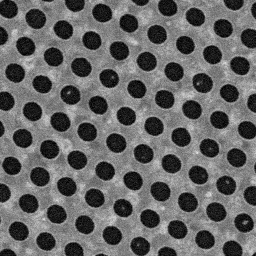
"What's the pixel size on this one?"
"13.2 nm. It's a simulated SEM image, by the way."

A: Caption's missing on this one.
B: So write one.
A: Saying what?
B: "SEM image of a regular array of holes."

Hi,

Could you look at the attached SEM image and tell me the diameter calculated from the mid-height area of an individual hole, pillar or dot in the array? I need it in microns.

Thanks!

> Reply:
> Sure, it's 0.269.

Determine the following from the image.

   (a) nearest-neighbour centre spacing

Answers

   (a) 382 nanometres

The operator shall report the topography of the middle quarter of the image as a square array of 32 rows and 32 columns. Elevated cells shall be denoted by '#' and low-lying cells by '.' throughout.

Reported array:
##.....###########.....##....###
##.....###..#######...###.....##
##.....##....############.....##
#########.....############....##
#########.....##....############
...#######...###....############
....############.....###..######
....############....###....#####
....###...#######..####.....####
....##.....############.....##..
######.....############....###..
#######....##....############...
.#######..###.....############..
.############.....###..########.
..###.########....##.....#######
..##....############.....#######
.##.....############.....##....#
###.....###...#######...###.....
####....##.....############.....
######.###......###########.....
###########.....##...#######...#
##..#######....##.....##########
#....############......###.#####
#.....############....###....###
#.....###..#######....##.....###
#.....##....############.....###
###.####.....############....##.
########.....##....########.###.
..#######...###.....###########.
...############.....###..#######
...############.....##....######
...###...########..##......#####